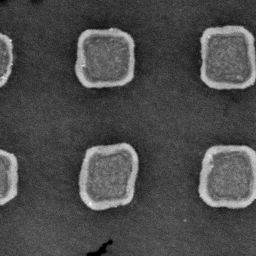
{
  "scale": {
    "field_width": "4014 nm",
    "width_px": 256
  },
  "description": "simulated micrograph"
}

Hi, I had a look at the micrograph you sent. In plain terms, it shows raised bodies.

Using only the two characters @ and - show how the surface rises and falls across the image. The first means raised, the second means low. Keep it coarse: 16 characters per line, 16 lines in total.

----------------
----------------
-----@@@-----@@@
@----@@@-----@@@
@----@@@-----@@@
----------------
----------------
----------------
----------------
------@@-----@@@
@----@@@-----@@@
@----@@@-----@@@
-----@@@-----@@@
----------------
----------------
----------------